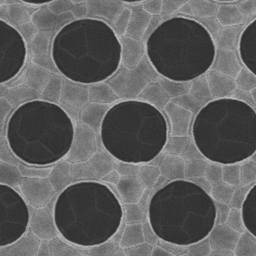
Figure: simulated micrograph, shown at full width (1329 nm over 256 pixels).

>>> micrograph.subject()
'holes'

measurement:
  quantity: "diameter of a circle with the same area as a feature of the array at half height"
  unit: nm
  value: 335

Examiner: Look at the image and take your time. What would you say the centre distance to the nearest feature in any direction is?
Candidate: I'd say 487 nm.